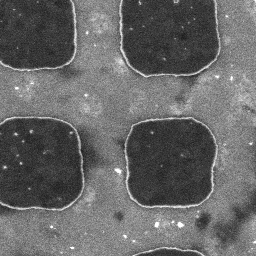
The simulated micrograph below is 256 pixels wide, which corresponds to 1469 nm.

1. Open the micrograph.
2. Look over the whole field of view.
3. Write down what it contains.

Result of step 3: raised bodies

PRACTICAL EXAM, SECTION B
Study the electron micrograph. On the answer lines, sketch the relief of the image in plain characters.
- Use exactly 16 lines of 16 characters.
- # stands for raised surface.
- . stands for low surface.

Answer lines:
#####...#####...
#####...######..
#####...######..
#####...######..
.........###....
................
................
####.....###....
#####...#####...
#####...######..
#####...#####...
#####...#####...
#####...#####...
................
................
..........#.....